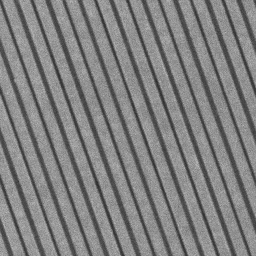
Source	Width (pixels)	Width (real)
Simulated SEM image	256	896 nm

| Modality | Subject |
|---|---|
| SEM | parallel lines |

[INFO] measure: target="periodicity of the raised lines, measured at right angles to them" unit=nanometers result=52.4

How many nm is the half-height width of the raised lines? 37.9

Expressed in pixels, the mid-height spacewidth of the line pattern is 4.